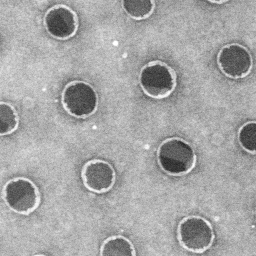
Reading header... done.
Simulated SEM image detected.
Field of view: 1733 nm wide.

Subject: a regular array of raised bodies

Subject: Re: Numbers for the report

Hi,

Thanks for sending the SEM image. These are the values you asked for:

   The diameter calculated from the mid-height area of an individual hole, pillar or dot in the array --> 245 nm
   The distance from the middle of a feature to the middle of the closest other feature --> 538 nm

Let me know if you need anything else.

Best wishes